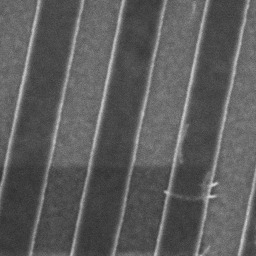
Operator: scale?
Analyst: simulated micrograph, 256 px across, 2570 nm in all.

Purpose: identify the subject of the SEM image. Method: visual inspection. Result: lines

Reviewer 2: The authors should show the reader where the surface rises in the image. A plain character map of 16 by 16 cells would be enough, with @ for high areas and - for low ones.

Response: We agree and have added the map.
--@@@---@@---@@-
--@@@--@@@---@@-
--@@@--@@@--@@@-
--@@@--@@@--@@@-
--@@---@@@--@@@-
-@@@---@@---@@--
-@@@--@@@---@@--
-@@@--@@@--@@@--
-@@---@@@--@@@--
@@@---@@---@@@--
@@@---@@---@@---
@@@--@@@---@@---
@@@--@@@--@@@---
@@---@@@--@@@--@
@@---@@---@@@--@
@@---@@---@@---@